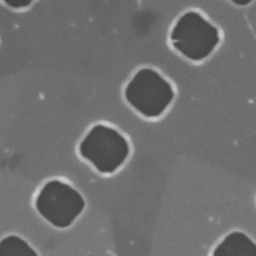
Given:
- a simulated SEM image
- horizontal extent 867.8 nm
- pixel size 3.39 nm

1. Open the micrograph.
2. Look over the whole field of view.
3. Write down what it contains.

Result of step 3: holes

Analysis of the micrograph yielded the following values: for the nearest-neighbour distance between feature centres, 242 nm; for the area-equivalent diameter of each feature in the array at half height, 154 nm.